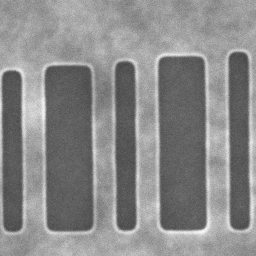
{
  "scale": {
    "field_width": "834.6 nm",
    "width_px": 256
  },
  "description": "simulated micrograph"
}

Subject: groups of lines, slits or small figures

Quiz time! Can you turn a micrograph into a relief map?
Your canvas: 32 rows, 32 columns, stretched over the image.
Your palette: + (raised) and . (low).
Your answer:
++++++++++++++++++++++++++++++++
++++++++++++++++++++++++++++++++
++++++++++++++++++++++++++++++++
++++++++++++++++++++++++++++++++
++++++++++++++++++++++++++++++++
++++++++++++++++++++++++++++++++
+++++++++++++++++++++++++++++.++
++++++++++++++++++++......++...+
++++++.....+++...+++......++...+
...++.......++...+++......++...+
...++.......++...+++......++...+
...++.......++...+++......++...+
...++.......++...+++......++...+
...++.......++...+++......++...+
...+++......++...+++......++...+
...+++......++...+++......++...+
...+++......++...+++......++...+
...+++......++...+++......++...+
...+++......++...+++......+++..+
...+++......++...+++......+++..+
...+++......++...+++......+++..+
...+++......++...+++......+++..+
...+++......++...+++......+++..+
...+++......++...+++......+++..+
...+++......++...+++......+++..+
...+++......++...+++......+++..+
...+++......++...+++......+++..+
...+++......++...+++......+++..+
...+++......+++..+++......+++..+
++++++++++++++++++++++++++++++++
++++++++++++++++++++++++++++++++
++++++++++++++++++++++++++++++++